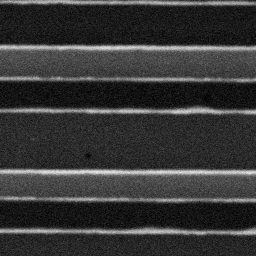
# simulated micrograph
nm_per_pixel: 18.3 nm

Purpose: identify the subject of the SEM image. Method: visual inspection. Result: lines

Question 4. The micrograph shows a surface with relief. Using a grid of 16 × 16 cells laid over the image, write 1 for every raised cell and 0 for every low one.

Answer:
0000000000000000
0000000000000000
0000000000000000
1111111111111111
1111111111111111
1111111111111111
1111111111111111
0000000000000000
0000000000000000
0000000000000000
0000000000000000
1111111111111111
1111111111111111
1111111111111111
1111111111111111
0000000000000000